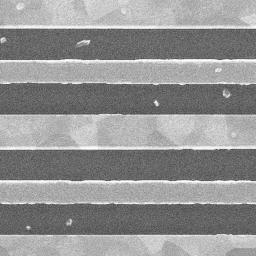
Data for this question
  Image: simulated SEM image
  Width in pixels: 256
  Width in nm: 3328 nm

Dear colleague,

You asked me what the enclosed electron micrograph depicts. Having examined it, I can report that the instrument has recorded lines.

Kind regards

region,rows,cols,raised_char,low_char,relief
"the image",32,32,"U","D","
UUUUUUUUUUUUUUUUUUUUUUUUUUUUUUUU
UUUUUUUUUUUUUUUUUUUUUUUUUUUUUUUU
UUUUUUUUUUUUUUUUUUUUUUUUUUUUUUUU
DDDDDDDDDDDDDDDDDDDDDDDDDDDDDDDD
DDDDDDDDDDDDDDDDDDDDDDDDDDDDDDDD
DDDDDDDDDDDDDDDDDDDDDDDDDDDDDDDD
DDDDDDDDDDDDDDDDDDDDDDDDDDDDDDDD
DDDDDDDDDDDDDDDDDDDDDDDDDDDDDDDD
UUUUUUUUUUUUUUUUUUUUUUUUUUUUUUUU
UUUUUUUUUUUUUUUUUUUUUUUUUUUUUUUU
DDDDDDDDDDDDDDDDDDDUDDUDDDDDDDUU
DDDDDDDDDDDDDDDDDDDDDDDDDDDDDDDD
DDDDDDDDDDDDDDDDDDDDDDDDDDDDDDDD
DDDDDDDDDDDDDDDDDDDDDDDDDDDDDDDD
UUUUUUUUUUUUUUUUUUUUUUUUUUUUUUUU
UUUUUUUUUUUUUUUUUUUUUUUUUUUUUUUU
UUUUUUUUUUUUUUUUUUUUUUUUUUUUUUUU
UUUUUUUUUUUUUUUUUUUUUUUUUUUUUUUU
UUUUUUUUUUUUUUUUUUUUUUUDUUUUUDDD
DDDDDDDDDDDDDDDDDDDDDDDDDDDDDDDD
DDDDDDDDDDDDDDDDDDDDDDDDDDDDDDDD
DDDDDDDDDDDDDDDDDDDDDDDDDDDDDDDD
DDDDDDDDDDDDDDDDDDDDDDDDDDDDDDDD
UUUUUUUUUUUUUUUUUUUUUUUUUUUUUUUU
UUUUUUUUUUUUUUUUUUUUUUUUUUUUUUUU
DDDDDDDDDDDDDDDDDDDDDDDDDDDDDDDD
DDDDDDDDDDDDDDDDDDDDDDDDDDDDDDDD
DDDDDDDDDDDDDDDDDDDDDDDDDDDDDDDD
DDDDDDDDDDDDDDDDDDDDDDDDDDDDDDDD
UUUUUUUUUUUUUUUUUUUUUUUUUUUUUUUU
UUUUUUUUUUUUUUUUUUUUUUUUUUUUUUUU
UUUUUUUUUUUUUUUUUUUUUUUUUUUUUUUU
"